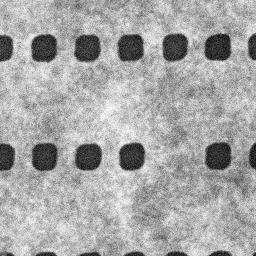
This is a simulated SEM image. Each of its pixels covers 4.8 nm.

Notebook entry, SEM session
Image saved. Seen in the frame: a regular array of holes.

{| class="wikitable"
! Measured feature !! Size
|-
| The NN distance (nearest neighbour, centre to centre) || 208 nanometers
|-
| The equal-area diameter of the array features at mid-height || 0.138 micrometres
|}